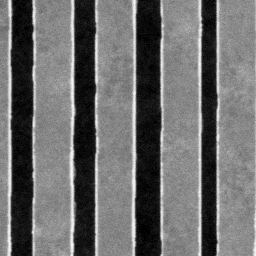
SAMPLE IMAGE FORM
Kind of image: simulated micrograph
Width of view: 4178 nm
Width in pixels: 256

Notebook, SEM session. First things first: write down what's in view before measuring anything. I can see lines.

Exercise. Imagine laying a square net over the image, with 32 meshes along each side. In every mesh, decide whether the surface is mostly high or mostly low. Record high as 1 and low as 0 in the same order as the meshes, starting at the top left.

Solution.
10001111100011111000111110011111
10001111100011111000111110011111
10001111100011111000111110011111
10001111100011111000111110011111
10001111100011111000111110011111
10001111100011111000111110011111
10001111100011111000111110011111
10001111100011111000111110011111
10001111100011111000111110011111
10001111100011111000111110011111
10001111100011111000111110011111
10001111100011111000111110011111
10001111100011111000111110011111
10001111100011111000111110011111
10001111100011111000111110011111
10001111100011111000111110011111
10001111100011111000111110011111
10001111100011111000111110011111
10001111100011111000111110011111
10001111100011111000111110011111
10001111100011111000111110011111
10001111100011111000111110011111
10001111100011111000111110011111
10001111100011111000111110011111
10001111100011111000111110011111
10001111100011111000111110011111
10001111100011111000111110011111
10001111100011111000111110011111
10001111100011111000111110011111
10001111100011111000111110011111
10001111100011111000111110011111
10001111100011111000111110011111